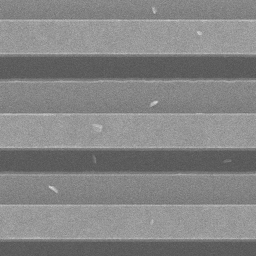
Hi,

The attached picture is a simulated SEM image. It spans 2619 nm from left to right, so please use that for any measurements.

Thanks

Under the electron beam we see lines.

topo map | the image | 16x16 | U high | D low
UUUUUUUUUUUUUUUU
UUUUUUUUUUUUUUUU
UUUUUUUUUUUUUUUU
DDDDDDDDDDDDDDDD
DDDDDDDDDDDDDDDD
UUUUUUUUUUUUUUUU
UUUUUUUUUUUUUUUU
UUUUUUUUUUUUUUUU
UUUUUUUUUUUUUUUU
DDDDDDDDDDDDDDDD
DDDDDDDDDDDDDDDD
UUUUUUUUUUUUUUUU
UUUUUUUUUUUUUUUU
UUUUUUUUUUUUUUUU
UUUUUUUUUUUUUUUU
DDDDDDDDDDDDDDDD